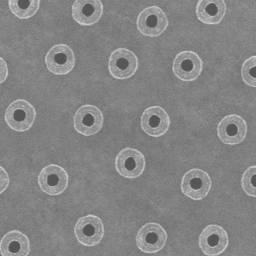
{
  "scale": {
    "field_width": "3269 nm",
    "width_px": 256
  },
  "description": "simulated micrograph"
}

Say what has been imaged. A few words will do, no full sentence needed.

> a regular array of ring-shaped raised bodies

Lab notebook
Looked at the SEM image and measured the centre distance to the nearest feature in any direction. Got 755 nanometres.